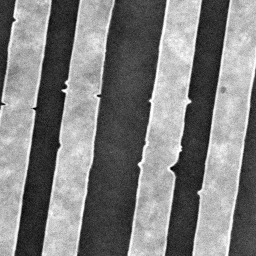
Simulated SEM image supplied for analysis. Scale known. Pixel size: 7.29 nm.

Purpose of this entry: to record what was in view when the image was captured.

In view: one or a few lines or trenches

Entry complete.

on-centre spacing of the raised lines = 537 nanometres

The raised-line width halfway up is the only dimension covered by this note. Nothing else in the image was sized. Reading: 245 nm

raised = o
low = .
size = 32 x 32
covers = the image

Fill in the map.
..oooo....oooo.......oooo....ooo
..oooo....oooo.......oooo....ooo
..oooo....oooo.......oooo...oooo
.ooooo....ooo.......ooooo...oooo
.ooooo...oooo.......oooo....oooo
.ooooo...oooo.......oooo....oooo
.oooo....oooo.......oooo....oooo
.oooo....oooo.......oooo....oooo
.oooo....oooo.......oooo....oooo
.oooo....oooo.......oooo...ooooo
.oooo...ooooo......ooooo...oooo.
ooooo...oooo.......ooooo...oooo.
oooo....oooo.......ooooo...oooo.
oooo....oooo.......oooo....oooo.
oooo....oooo.......oooo....oooo.
oooo....oooo.......oooo...ooooo.
oooo....oooo......ooooo...ooooo.
oooo....oooo......ooooo...ooooo.
oooo....oooo......ooooo...oooo..
oooo...ooooo......oooo....oooo..
ooo....oooo.......oooo....oooo..
ooo....oooo.......ooo.....oooo..
ooo....oooo......ooooo...ooooo..
ooo....oooo......ooooo...ooooo..
ooo...ooooo......ooooo...ooooo..
ooo...oooo.......oooo....oooo...
ooo...oooo.......oooo....oooo...
oo....oooo.......oooo....oooo...
oo....oooo.......oooo....oooo...
oo....oooo......ooooo...ooooo...
oo...ooooo......ooooo...ooooo...
oo...ooooo......ooooo...oooo....